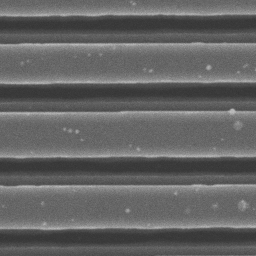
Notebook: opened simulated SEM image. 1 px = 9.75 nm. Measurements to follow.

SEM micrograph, lines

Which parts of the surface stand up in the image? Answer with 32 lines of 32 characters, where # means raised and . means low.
################################
################################
................................
................................
################################
################################
################################
################################
################################
################################
..#.............................
................................
................................
################################
################################
################################
################################
################################
################################
################################
................................
................................
################################
################################
################################
################################
################################
################################
#########################....#..
................................
................................
################################